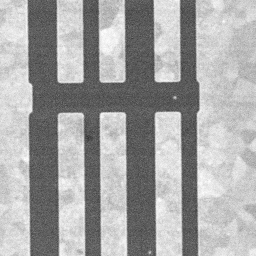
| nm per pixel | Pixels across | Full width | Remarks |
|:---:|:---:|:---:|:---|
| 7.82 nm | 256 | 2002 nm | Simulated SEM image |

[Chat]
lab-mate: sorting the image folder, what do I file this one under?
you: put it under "groups of lines, slits or small figures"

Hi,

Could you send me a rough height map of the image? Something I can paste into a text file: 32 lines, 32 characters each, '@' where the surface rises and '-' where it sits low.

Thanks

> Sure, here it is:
@@@----@@@---@@----@@@---@@@@@@@
@@@----@@@---@@----@@@---@@@@@@@
@@@----@@@---@@----@@@---@@@@@@@
@@@----@@@---@@----@@@---@@@@@@@
@@@----@@@---@@----@@@---@@@@@@@
@@@----@@@---@@@---@@@---@@@@@@@
@@@----@@@---@@@---@@@---@@@@@@@
@@@----@@@---@@@---@@@---@@@@@@@
@@@----@@@---@@@---@@@---@@@@@@@
@@@----@@@---@@@---@@@---@@@@@@@
@@@@---------------------@@@@@@@
@@@@---------------------@@@@@@@
@@@@---------------------@@@@@@@
@@@@---------------------@@@@@@@
@@@@----@@---@@@---@@@---@@@@@@@
@@@----@@@---@@@---@@@---@@@@@@@
@@@----@@@---@@@---@@@@--@@@@@@@
@@@----@@@---@@@---@@@@--@@@@@@@
@@@----@@@---@@@---@@@@--@@@@@@@
@@@@---@@@---@@@----@@@--@@@@@@@
@@@@---@@@---@@@----@@@--@@@@@@@
@@@@---@@@---@@@----@@@--@@@@@@@
@@@@---@@@---@@@----@@@--@@@@@@@
@@@@---@@@---@@@----@@@--@@@@@@@
@@@@---@@@---@@@----@@@--@@@@@@@
@@@@---@@@---@@@----@@@--@@@@@@@
@@@@---@@@---@@@----@@@--@@@@@@@
@@@@---@@@---@@@----@@@--@@@@@@@
@@@@---@@@@--@@@----@@@--@@@@@@@
@@@@---@@@@--@@@----@@@--@@@@@@@
@@@@---@@@@--@@@----@@@--@@@@@@@
@@@@---@@@@--@@@----@@@--@@@@@@@